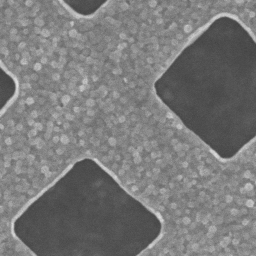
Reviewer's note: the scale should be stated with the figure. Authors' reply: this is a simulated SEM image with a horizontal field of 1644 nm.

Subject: holes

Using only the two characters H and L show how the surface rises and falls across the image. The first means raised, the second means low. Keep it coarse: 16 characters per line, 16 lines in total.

HHHHLLHHHHHHHHHH
HHHHHHHHHHHHHLLH
HHHHHHHHHHHHLLLL
HHHHHHHHHHHLLLLL
HHHHHHHHHHLLLLLL
LHHHHHHHHHLLLLLL
HHHHHHHHHHLLLLLL
HHHHHHHHHHHLLLLL
HHHHHHHHHHHHLLLL
HHHHHHHHHHHHHLLH
HHHHLLHHHHHHHHHH
HHHLLLLHHHHHHHHH
HHLLLLLLLHHHHHHH
HLLLLLLLLLHHHHHH
HLLLLLLLLLHHHHHH
HHLLLLLLLHHHHHHH